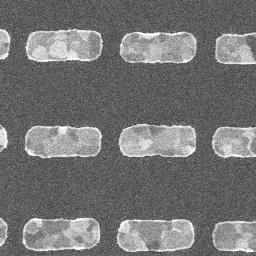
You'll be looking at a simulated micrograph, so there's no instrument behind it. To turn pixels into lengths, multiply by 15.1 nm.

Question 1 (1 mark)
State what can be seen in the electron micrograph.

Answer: raised bodies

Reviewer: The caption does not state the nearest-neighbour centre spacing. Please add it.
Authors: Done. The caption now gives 1.41 µm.